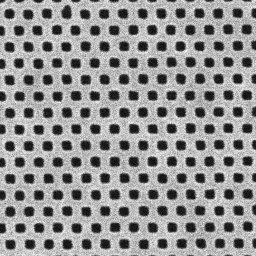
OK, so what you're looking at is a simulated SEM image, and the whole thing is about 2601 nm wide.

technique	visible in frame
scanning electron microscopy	a regular array of holes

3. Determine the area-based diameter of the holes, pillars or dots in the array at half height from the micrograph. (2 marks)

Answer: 112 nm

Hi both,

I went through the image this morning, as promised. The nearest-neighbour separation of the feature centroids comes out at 0.189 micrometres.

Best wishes